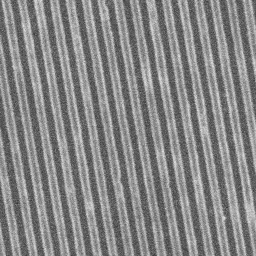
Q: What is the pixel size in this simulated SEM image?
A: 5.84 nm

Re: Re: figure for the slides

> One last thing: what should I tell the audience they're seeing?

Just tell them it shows parallel lines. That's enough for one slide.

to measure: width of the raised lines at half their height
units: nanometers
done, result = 41.8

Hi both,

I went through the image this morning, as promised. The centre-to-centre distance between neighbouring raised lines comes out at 92.5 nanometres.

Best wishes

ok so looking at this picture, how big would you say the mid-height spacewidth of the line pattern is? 8.13 pixels